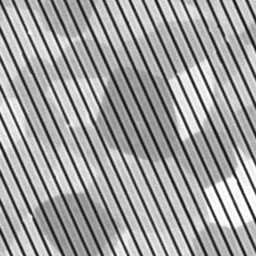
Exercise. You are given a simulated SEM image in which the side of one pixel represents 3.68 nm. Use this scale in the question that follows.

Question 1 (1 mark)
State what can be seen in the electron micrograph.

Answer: parallel lines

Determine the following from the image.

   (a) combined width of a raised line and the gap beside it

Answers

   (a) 43.6 nm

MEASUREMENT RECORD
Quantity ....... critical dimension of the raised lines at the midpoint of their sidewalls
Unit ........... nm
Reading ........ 31.9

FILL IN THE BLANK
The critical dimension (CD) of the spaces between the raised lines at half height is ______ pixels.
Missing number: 3.78